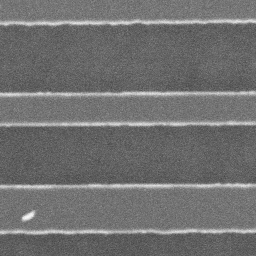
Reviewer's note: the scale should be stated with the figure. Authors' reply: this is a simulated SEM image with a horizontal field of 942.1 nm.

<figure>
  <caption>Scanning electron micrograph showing lines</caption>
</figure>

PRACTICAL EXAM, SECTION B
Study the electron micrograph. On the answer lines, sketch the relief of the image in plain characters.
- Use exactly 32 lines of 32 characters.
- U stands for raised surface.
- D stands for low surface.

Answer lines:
UUUUUUUUUUUUUUUUUUUUUUUUUUUUUUUU
UUUUUUUUUUUUUUUUUUUUUUUUUUUUUUUU
UUUUUUUUUUUUUUUUUUUUUUUUUUUUUUUU
DDDDDDDDDDDDDDDDDDDDDDDDDDDDDDDD
DDDDDDDDDDDDDDDDDDDDDDDDDDDDDDDD
DDDDDDDDDDDDDDDDDDDDDDDDDDDDDDDD
DDDDDDDDDDDDDDDDDDDDDDDDDDDDDDDD
DDDDDDDDDDDDDDDDDDDDDDDDDDDDDDDD
DDDDDDDDDDDDDDDDDDDDDDDDDDDDDDDD
DDDDDDDDDDDDDDDDDDDDDDDDDDDDDDDD
DDDDDDDDDDDDDDDDDDDDDDDDDDDDDDDD
DDDDDDDDDDDDDDDDDDDDDDDDDDDDDDUU
UUUUUUUUUUUUUUUUUUUUUUUUUUUUUUUU
UUUUUUUUUUUUUUUUUUUUUUUUUUUUUUUU
UUUUUUUUUUUUUUUUUUUUUUUUUUUUUUUU
UUUUUUUUUUUUUUUUUUUUUUUUUUUUUUUU
DDDDDDDDDDDDDDDDDDDDDDDDDDDDDDDD
DDDDDDDDDDDDDDDDDDDDDDDDDDDDDDDD
DDDDDDDDDDDDDDDDDDDDDDDDDDDDDDDD
DDDDDDDDDDDDDDDDDDDDDDDDDDDDDDDD
DDDDDDDDDDDDDDDDDDDDDDDDDDDDDDDD
DDDDDDDDDDDDDDDDDDDDDDDDDDDDDDDD
DDDDDDDDDDDDDDDDDDDDDDDDDDDDDDDD
UUUUUUUUUUUUUUUUUUUUUUUUUUUUUUUU
UUUUUUUUUUUUUUUUUUUUUUUUUUUUUUUU
UUUUUUUUUUUUUUUUUUUUUUUUUUUUUUUU
UUUUUUUUUUUUUUUUUUUUUUUUUUUUUUUU
UUUUUUUUUUUUUUUUUUUUUUUUUUUUUUUU
UUUUUUUUUUUUUUUUUUUUUUUUUUUUUUUU
DDDDDDDDDDDDDDDDDDDDDDDDDDDDDDDD
DDDDDDDDDDDDDDDDDDDDDDDDDDDDDDDD
DDDDDDDDDDDDDDDDDDDDDDDDDDDDDDDD